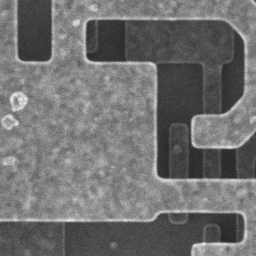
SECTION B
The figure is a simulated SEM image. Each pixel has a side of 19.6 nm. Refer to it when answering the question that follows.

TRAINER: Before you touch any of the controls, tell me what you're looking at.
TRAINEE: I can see wiring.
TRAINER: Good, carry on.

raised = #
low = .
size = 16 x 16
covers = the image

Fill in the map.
#..#############
#..###........##
#..##..........#
#..##..........#
##########.....#
##########.....#
##########.....#
##########..####
##########..####
##########......
##########......
################
################
##########.....#
...............#
............####